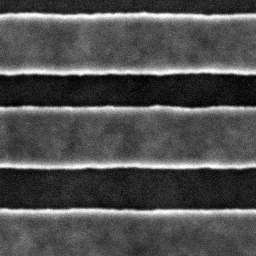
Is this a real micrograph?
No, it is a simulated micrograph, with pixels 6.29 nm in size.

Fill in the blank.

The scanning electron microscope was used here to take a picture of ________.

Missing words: lines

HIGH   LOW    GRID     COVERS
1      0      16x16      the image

0000000000000000
1111111111111111
1111111111111111
1111111111111111
1111111111111111
0000000000000000
0000000000000000
1111111111111111
1111111111111111
1111111111111111
0000000000000000
0000000000000000
0000000000000000
1111111111111111
1111111111111111
1111111111111111